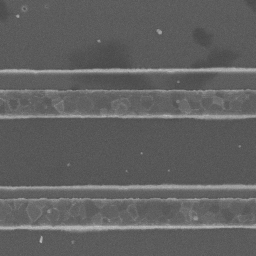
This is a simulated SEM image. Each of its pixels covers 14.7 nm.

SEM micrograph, lines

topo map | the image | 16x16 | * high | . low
................
................
................
................
****************
****************
****************
................
................
................
................
................
****************
****************
................
................